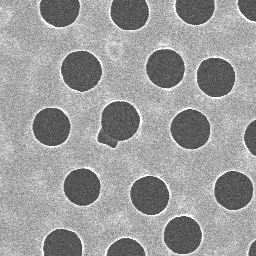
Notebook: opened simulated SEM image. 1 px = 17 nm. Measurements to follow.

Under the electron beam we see a regular array of holes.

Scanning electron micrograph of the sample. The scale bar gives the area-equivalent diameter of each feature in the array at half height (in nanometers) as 670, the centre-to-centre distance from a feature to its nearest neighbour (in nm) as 1030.